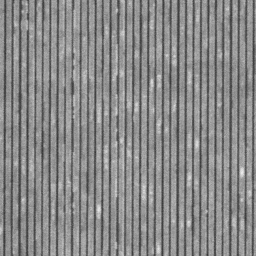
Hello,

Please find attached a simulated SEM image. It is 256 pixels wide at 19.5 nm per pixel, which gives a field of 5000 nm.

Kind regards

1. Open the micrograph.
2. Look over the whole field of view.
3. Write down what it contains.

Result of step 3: parallel lines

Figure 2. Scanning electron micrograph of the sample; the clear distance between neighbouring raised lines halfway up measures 56.1 nm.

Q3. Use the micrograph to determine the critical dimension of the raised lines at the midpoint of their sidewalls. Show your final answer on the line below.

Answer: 100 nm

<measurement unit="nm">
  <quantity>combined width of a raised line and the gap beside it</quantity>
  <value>147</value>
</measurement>